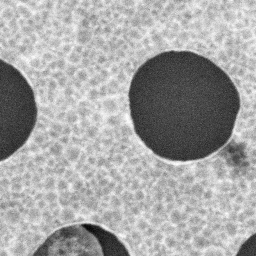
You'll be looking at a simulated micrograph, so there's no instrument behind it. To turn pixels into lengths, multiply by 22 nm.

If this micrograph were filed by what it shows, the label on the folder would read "holes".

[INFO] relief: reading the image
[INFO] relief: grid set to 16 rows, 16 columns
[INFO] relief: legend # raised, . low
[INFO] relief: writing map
################
################
################
##########...###
.#######......##
..######.......#
..######.......#
..######.......#
..#######.....##
.########....###
################
################
################
################
###....#########
##......#######.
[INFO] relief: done